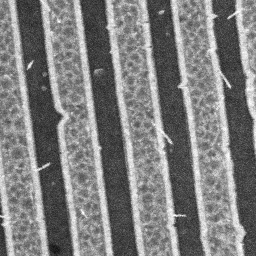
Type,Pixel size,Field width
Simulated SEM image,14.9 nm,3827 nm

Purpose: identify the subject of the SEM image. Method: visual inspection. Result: one or a few lines or trenches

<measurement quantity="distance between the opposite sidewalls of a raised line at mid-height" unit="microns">0.483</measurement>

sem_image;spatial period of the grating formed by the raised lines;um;0.966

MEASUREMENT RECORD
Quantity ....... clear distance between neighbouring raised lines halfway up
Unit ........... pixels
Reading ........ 32.3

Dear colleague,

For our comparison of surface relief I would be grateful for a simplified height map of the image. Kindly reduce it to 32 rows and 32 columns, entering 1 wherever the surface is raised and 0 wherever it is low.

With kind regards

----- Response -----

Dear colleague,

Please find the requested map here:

10000111100000111100001111000011
11000011110000111100001111000011
11000011110000111100001111000011
11000011110000111100001111000011
11000011110000111100001111000011
11000011110000111100000111100001
11000011110000111110000111100001
11000011111000011110000111100001
11000001111000011110000111100001
11100001111000011110000111100001
11100001111000011110000111100001
11100001111000011110000111100001
11100001111000011110000011110001
11100001111000011110000011110000
11100000111000001111000011110000
11100000111100001111000011110000
11110000111100001111000011110000
11110000111100001111000011110000
11110000111100001111000011110000
11110000111100001111000001110000
11110000111100001111000001111000
11110000111100000111100001111000
11110000011100000111100001111000
11111000011110000111100001111000
01111000011110000111100001111000
01111000011110000111100001111000
01111000011110000111100001111000
01111000011110000111100001111000
01111000011110000111100000111100
01111000011110000111110000111100
01111000001110000011110000111100
01111100001111000011110000111100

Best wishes